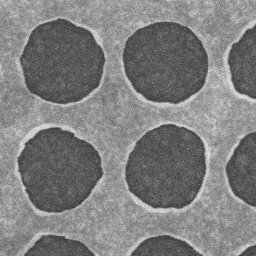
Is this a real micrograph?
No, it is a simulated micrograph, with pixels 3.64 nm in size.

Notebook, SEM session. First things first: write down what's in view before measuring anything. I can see holes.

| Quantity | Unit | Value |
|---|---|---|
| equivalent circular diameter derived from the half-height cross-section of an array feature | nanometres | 310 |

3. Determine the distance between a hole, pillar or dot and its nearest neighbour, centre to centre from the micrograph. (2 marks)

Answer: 0.377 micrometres